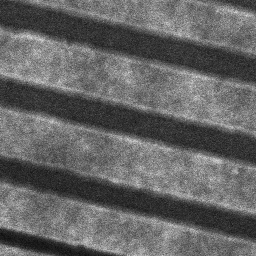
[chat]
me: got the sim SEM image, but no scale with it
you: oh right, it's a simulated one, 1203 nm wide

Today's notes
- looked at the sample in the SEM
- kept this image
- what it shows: one or a few lines or trenches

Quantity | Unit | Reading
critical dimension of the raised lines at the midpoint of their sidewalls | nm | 222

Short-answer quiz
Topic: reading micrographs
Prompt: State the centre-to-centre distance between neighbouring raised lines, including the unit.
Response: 0.358 um